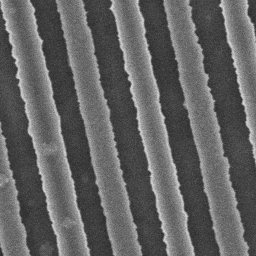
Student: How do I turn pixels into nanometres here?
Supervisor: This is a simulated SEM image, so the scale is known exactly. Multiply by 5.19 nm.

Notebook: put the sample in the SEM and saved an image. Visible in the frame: lines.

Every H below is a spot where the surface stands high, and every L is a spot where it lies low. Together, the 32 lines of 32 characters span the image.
HHHHLLLHHHLLLLHHHLLLLHHHLLLLHHHL
HHHHLLLHHHHLLLHHHHLLLHHHLLLLHHHL
LHHHLLLLHHHLLLHHHHLLLHHHLLLLHHHL
LHHHHLLLHHHLLLLHHHLLLHHHLLLLHHHH
LHHHHLLLHHHLLLLHHHLLLHHHHLLLHHHH
LHHHHLLLHHHHLLLHHHLLLLHHHLLLLHHH
LLHHHLLLHHHHLLLHHHHLLLHHHLLLLHHH
LLHHHHLLLHHHLLLHHHHLLLHHHLLLLHHH
LLHHHHLLLHHHLLLLHHHLLLHHHLLLLHHH
LLHHHHLLLHHHLLLLHHHLLLHHHHLLLLHH
LLHHHHLLLHHHHLLLHHHHLLLHHHLLLLHH
LLLHHHHLLLHHHLLLHHHHLLLHHHLLLLHH
LLLHHHHLLLHHHLLLLHHHLLLHHHHLLLHH
LLLHHHHLLLHHHHLLLHHHLLLHHHHLLLLH
LLLHHHHLLLHHHHLLLHHHLLLLHHHLLLLH
LLLLHHHLLLLHHHLLLHHHHLLLHHHLLLLH
LLLLHHHHLLLHHHLLLHHHHLLLHHHLLLLH
HLLLHHHHLLLHHHLLLLHHHLLLHHHHLLLH
HLLLHHHHLLLHHHLLLLHHHLLLLHHHLLLL
HLLLLHHHLLLHHHHLLLHHHLLLLHHHLLLL
HLLLLHHHHLLLHHHLLLLHHHLLLHHHHLLL
HLLLLHHHHLLLHHHLLLLHHHLLLHHHHLLL
HHLLLHHHHLLLHHHLLLLHHHLLLHHHHLLL
HHLLLHHHHLLLHHHHLLLHHHLLLLHHHLLL
HHLLLLHHHHLLHHHHLLLHHHHLLLHHHLLL
HHLLLLHHHHLLLHHHLLLLHHHLLLHHHHLL
HHLLLLHHHHLLLHHHLLLLHHHLLLHHHHLL
HHHLLLHHHHLLLHHHHLLLHHHLLLLHHHLL
HHHLLLLHHHLLLHHHHLLLHHHLLLLHHHLL
HHHLLLLHHHHLLLHHHLLLLHHHLLLHHHLL
HHHLLLLHHHHLLLHHHLLLLHHHLLLHHHHL
HHHHLLLHHHHLLLHHHHLLLHHHLLLLHHHL